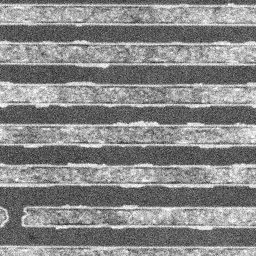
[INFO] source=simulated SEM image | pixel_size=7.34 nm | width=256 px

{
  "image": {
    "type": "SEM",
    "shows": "parallel lines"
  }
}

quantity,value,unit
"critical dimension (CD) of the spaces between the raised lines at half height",18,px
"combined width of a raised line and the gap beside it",297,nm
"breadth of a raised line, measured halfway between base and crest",0.158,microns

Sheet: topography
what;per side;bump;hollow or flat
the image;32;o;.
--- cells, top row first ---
oooooooooooooooooooooooooooooooo
.........o......................
................................
oooooooooooooooooooooooooooooooo
oooooooooooooooooooooooooooooooo
.........o.......ooooooooooooooo
................................
................................
oooooooooooooooooooooooooooooooo
oooooooooooooooooooooooooooooooo
oooooooooooooooooooooooooooooooo
......................o.........
................................
oooooooooooooooooooooooooooooooo
oooooooooooooooooooooooooooooooo
oooooooooooooooooooooooooooooooo
................................
................................
oooooooooooooooooooooooooooooooo
oooooooooooooooooooooooooooooooo
oooooooooooooooooooooooooooooooo
................................
................................
oooooooooooooooooooooooooooooooo
oooooooooooooooooooooooooooooooo
oooooooooooooooooooooooooooooooo
.oo.............................
.oo.............................
oooooooooooooooooooooooooooooooo
oooooooooooooooooooooooooooooooo
oooooooooooooooooooooooooooooooo
................................